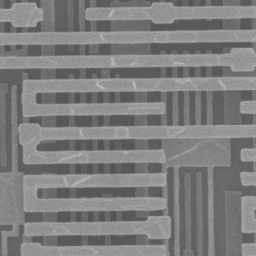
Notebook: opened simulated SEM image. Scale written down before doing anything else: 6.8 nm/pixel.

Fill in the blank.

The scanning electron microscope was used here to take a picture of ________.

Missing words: wiring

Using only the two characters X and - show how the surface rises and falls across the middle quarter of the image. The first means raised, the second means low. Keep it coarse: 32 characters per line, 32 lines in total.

XXXXXXXXXXXXXXXXXXXXXXXXXXXXXXXX
--------------------------------
--------------------------------
--------------------------------
XXXXXXXXXXXXXXXXXXXXXXXXXXXXXXXX
XXXXXXXXXXXXXXXXXXXXXXXXXXXXXXXX
XXXXXXXXXXXXXXXXXXXXXXXXXXXXX---
--------------------------------
--------------------------------
--------------------------------
XXXXXXXXXXXXXXXXXXXXXXXXX-------
XXXXXXXXXXXXXXXXXXXXXXXXX-------
XXXXXXXXXXXXX--XXX--------------
--------------------------------
--------------------------------
-------------------------------X
XXXXXXXXXXXXXXXXXXXXXXXXXXXXXXXX
XXXXXXXXXXXXXXXXXXXXXXXXXXXXXXXX
XXXXXXXXXXXXXXXXXXXXXXXX--------
--------------------------------
--------------------------------
-----------------------XX-------
XXXXXXXXXXXXXXXXXXXXXXXXX-------
XXXXXXXXXXXXXXXXXXXXXXXXX-------
XXXXXXXXXXXXXXXXXX-----XX-------
--------------------------------
--------------------------------
--------------------XXXXX-------
XXXXXXXXXXXXXXXXXXXXXXXXX-------
XXXXXXXXXXXXXXXXXXXXXXXXX-------
XXXXXXXXXXXXXXXXXXXXX--XX-------
--------------------------------